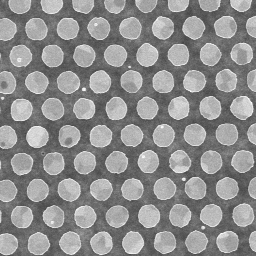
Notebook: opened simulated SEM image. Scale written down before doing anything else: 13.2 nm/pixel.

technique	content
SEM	a regular array of raised bodies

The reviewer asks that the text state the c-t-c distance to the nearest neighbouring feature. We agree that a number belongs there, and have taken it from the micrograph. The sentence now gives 30.8 pixels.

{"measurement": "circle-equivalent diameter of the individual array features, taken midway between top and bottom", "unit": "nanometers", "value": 290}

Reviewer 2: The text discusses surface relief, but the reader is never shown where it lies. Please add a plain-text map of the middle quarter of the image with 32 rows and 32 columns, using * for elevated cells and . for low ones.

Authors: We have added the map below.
....**......**......*...........
................................
***....****....****....****....*
***....****...*****...*****...**
****...*****..*****...*****...**
****...*****..*****...*****...**
***....****....****....****....*
................................
............**......*.......**..
...****....****....****....****.
...*****...*****..*****...*****.
..******...*****..*****...*****.
...****....****....****...*****.
....***....****.....**.....***..
................................
**......**......**......**.....*
***....****....****....****...**
****...*****..******..******..**
****...*****..******..*****...**
***....****....****....****....*
**......**.......*......**......
................................
....***.....***....****....****.
...*****...*****...*****...****.
...*****..******...*****..******
...*****...*****...****....****.
...****....****....****....****.
.....*..........................
.........................*......
***....****....****....****....*
****...*****...*****...*****..**
****...*****..******...*****..**